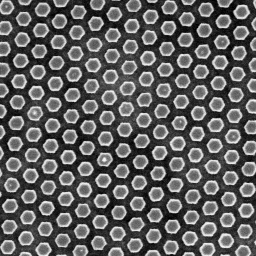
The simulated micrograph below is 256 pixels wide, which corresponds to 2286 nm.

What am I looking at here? a regular array of raised bodies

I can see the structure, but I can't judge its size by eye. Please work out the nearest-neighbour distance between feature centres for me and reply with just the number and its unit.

183 nm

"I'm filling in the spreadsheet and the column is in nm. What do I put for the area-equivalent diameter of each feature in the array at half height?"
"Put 122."